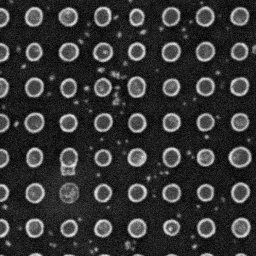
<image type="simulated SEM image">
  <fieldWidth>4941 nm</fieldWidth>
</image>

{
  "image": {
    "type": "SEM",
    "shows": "a regular array of raised bodies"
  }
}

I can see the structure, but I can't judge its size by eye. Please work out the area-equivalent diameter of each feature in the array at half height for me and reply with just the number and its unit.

326 nm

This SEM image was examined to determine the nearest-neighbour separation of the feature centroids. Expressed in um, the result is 0.658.